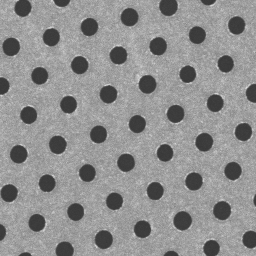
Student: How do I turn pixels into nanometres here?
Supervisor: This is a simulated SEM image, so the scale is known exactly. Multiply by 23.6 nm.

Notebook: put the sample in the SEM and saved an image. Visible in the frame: a regular array of holes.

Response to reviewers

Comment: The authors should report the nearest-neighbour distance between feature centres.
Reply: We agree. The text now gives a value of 936 nanometres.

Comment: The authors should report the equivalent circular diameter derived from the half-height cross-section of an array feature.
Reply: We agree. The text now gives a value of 425 nm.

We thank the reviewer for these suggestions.